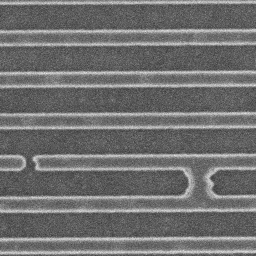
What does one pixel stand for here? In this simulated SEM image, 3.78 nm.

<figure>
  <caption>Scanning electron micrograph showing parallel lines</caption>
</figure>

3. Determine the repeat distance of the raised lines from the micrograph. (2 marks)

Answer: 157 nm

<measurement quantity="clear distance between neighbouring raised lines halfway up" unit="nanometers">103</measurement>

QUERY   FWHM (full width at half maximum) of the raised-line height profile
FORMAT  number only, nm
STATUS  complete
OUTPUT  53.4